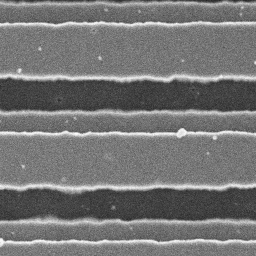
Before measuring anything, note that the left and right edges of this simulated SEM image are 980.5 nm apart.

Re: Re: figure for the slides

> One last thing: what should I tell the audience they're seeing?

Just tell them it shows lines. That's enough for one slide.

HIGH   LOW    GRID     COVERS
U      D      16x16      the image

UUUUUUUUUUUUUUUU
UUUUUUUUUUUUUUUU
UUUUUUUUUUUUUUUU
UUUUUUUUUUUUUUUU
UUUUUUUUUUUUUUUU
DDDDDDDDDDDDDDDD
DDDDDDDDDDDDDDDD
UUUUUUUUUUUUUUUU
UUUUUUUUUUUUUUUU
UUUUUUUUUUUUUUUU
UUUUUUUUUUUUUUUU
UUUUUUUUUUUUUUUU
DDDDDDDDDDDDDDDD
DDDDDDDDDDDDDDDD
UUUUUUUUUUUUUUUU
UUUUUUUUUUUUUUUU